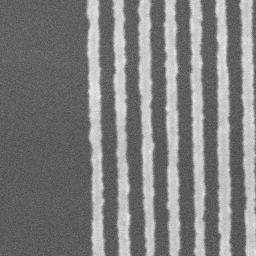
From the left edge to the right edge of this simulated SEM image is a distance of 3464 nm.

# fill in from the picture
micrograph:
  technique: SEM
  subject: parallel lines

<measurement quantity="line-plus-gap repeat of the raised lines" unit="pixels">25.5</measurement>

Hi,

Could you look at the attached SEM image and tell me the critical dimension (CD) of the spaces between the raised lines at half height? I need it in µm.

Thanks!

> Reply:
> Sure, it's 0.227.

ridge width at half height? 127 nanometers